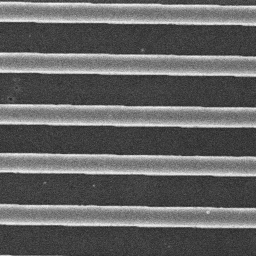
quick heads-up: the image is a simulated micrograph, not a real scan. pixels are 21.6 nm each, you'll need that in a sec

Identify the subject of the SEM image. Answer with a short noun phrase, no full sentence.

lines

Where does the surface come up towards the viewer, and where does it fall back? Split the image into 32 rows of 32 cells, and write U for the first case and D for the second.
UUUUUUUUUUUDDDDDDDDDDDDDDDDDDDDD
UUUUUUUUUUUUUUUUUUUUUUUUUUUUUUUU
UUUUUUUUUUUUUUUUUUUUUUUUUUUUUUUU
DDDDDDDDDDDDDDDDDDDDDDDDDDDDDDDD
DDDDDDDDDDDDDDDDDDDDDDDDDDDDDDDD
DDDDDDDDDDDDDDDDDDDDDDDDDDDDDDDD
DDDDDDDDDDDDDDDDDDDDDDDDDDDDDDDD
UUUUUUUUUUUUUUUUUUUUUUUUUUUUUUUU
UUUUUUUUUUUUUUUUUUUUUUUUUUUUUUUU
DDDDDDDDDDDDDDDDDDDDDDDDDDDDDDDU
DDDDDDDDDDDDDDDDDDDDDDDDDDDDDDDD
DDDDDDDDDDDDDDDDDDDDDDDDDDDDDDDD
DDDDDDDDDDDDDDDDDDDDDDDDDDDDDDDD
UUUUUUUUUUUUUUUUUUUUUUUUUDDDDDDD
UUUUUUUUUUUUUUUUUUUUUUUUUUUUUUUU
DDDDDDDDUUUUUUUUUUUUUUUUUUUUUUUU
DDDDDDDDDDDDDDDDDDDDDDDDDDDDDDDD
DDDDDDDDDDDDDDDDDDDDDDDDDDDDDDDD
DDDDDDDDDDDDDDDDDDDDDDDDDDDDDDDD
UUUUUUUUUUUUUUUUUUUUUDDDDDDDDDDD
UUUUUUUUUUUUUUUUUUUUUUUUUUUUUUUU
DDDUUUUUUUUUUUUUUUUUUUUUUUUUUUUU
DDDDDDDDDDDDDDDDDDDDDDDDDDDDDDDD
DDDDDDDDDDDDDDDDDDDDDDDDDDDDDDDD
DDDDDDDDDDDDDDDDDDDDDDDDDDDDDDDD
DDDDDDDDDDDDDDDDDDDDDDDDDDDDDDDD
UUUUUUUUUUUUUUUUUUUUUUUUUUUUUUUU
UUUUUUUUUUUUUUUUUUUUUUUUUUUUUUUU
DDDDDDDDDDDDDDDDDDDDDDDDDDDDDDDD
DDDDDDDDDDDDDDDDDDDDDDDDDDDDDDDD
DDDDDDDDDDDDDDDDDDDDDDDDDDDDDDDD
DDDDDDDDDDDDDDDDDDDDDDDDDDDDDDDD